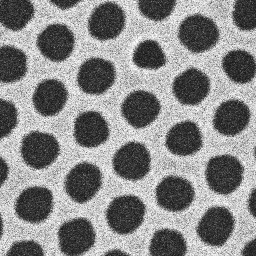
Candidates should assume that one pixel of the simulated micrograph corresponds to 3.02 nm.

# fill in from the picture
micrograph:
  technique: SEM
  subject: a regular array of holes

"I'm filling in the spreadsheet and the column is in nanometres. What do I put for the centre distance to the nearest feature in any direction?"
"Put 159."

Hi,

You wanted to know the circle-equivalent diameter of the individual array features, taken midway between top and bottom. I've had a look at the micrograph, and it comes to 117 nm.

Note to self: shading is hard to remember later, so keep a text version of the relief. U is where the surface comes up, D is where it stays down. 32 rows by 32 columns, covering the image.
DDDDUUUDDDUUUDDUUDDDDDUUUUUUUDDD
DDDDUUUUUUUUDDDDUDDDDDUUUUUUUDDD
DDDDUUUUUUUDDDDDUUUDUUUDDDDUUDDD
UDDUUUDDDUUDDDDDUUUUUUDDDDDUUUDD
UUUUUDDDDUUDDDDUUUUUUUDDDDDUUUUU
UUUUUDDDDUUUUUUUUDDDUUUDDDDUUUUU
DDDUUDDDDUUUUUUUUDDDUUUUDDUUUDDU
DDDUUUDDUUUDDUUUUDDDDUUUUUUUDDDD
DDDUUUUUUUDDDDUUUUDDUUUUDUUUDDDD
DDDUUUUUUUDDDDUUUUUUUUDDDDUUDDDD
UUUUUDDDUUDDDDUUUUUUUDDDDDUUUUDU
UUUUDDDDUUDDDUUUUDDUUUDDDDUUUUUU
DUUUDDDDUUUUUUUDDDDDUUDDDUUUUDUU
DDUUDDDDUUUUUUUDDDDDUUUUUUUDDDDU
DDUUUDDUUUDDDUUDDDDDUUUUUUUDDDDU
DDUUUUUUUDDDDDUUDDDUUUDDUUUDDDDU
DUUUDUUUUDDDDDUUUUUUUDDDDUUDDDUU
UUUDDDDUUDDDDUUUUUUUUDDDDUUUUUUU
UUUDDDDDUUUUUUUDDDUUUDDDDUUUUUUU
UUUDDDDUUUUUUUDDDDDUUUUUUUUDDUUU
DUUDDDUUUUDDUUDDDDDUUUUUUUDDDDUU
DUUUUUUUUDDDDUDDDDDUUUUUUUDDDDUU
DUUUUUUUDDDDDUUUDUUUDDDUUUDDDDUU
UUUDDDUUDDDDDUUUUUUDDDDDUUDDDDUU
UUDDDDDUUDDDUUUDDUUDDDDDUUUUUUUD
UUDDDDDUUUUUUUDDDDUUDDDDUUUUUUUD
UUDDDDUUUUUUUDDDDDUUUUDUUUDDDUUD
UUUDDDUUUDDUUDDDDDUUUUUUUDDDDUUU
UUUUUUUDDDDDUUDDDUUUUUUUUDDDDUUU
UUUUUUUDDDDDUUUUUUUDDDDUUDDDDUUU
UUDDDUUDDDDDUUUUUUUDDDDUUUDDUUUD
UDDDDDUUDDDUUDDDUUUDDDDUUUUUUUDD